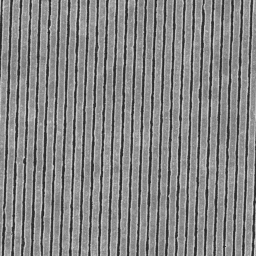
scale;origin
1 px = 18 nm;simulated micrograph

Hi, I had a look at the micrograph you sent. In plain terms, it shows parallel lines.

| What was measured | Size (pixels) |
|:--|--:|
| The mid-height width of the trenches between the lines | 3.5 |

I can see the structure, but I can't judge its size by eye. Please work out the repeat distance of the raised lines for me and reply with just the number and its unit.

173 nanometers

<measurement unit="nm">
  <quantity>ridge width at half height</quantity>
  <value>117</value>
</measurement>